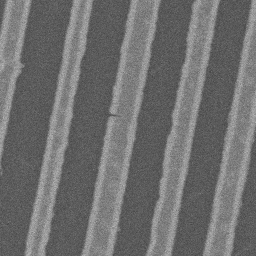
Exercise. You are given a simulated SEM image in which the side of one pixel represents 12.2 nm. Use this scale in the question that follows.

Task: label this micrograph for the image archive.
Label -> one or a few lines or trenches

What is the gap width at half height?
498 nm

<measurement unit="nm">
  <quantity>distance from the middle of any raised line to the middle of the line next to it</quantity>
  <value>734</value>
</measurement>